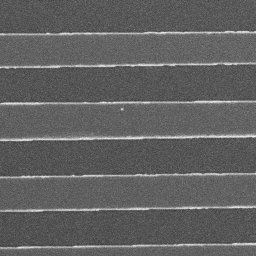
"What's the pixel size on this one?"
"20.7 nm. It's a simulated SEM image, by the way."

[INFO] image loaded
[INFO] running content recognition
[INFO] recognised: lines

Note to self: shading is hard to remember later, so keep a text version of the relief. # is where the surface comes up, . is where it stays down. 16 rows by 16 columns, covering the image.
................
................
################
################
................
................
################
################
###############.
................
................
################
################
................
................
.###############